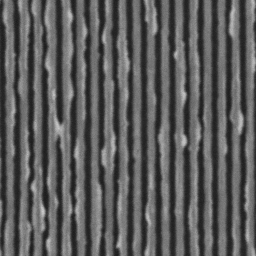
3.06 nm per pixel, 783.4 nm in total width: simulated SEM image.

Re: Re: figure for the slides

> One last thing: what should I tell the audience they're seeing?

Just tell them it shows parallel lines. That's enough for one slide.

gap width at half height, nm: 20.3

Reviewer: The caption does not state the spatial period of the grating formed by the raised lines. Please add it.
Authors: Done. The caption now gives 43.2 nanometres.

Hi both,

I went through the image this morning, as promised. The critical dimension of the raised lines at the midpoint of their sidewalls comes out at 23.3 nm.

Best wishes